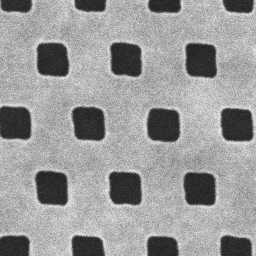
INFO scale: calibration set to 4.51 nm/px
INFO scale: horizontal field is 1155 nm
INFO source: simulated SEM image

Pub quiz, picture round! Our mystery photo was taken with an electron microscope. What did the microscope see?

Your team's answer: a regular array of holes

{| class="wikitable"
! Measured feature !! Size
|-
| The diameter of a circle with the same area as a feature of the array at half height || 0.162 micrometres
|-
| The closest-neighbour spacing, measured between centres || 73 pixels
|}